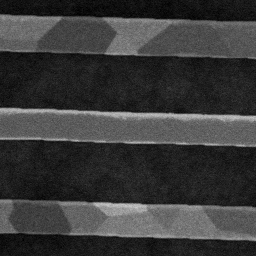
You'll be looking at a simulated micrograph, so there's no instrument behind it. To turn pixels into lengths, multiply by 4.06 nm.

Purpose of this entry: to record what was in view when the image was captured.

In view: lines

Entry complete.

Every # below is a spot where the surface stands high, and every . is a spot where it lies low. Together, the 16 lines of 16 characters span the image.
................
################
################
...........#####
................
................
................
################
################
................
................
................
................
################
################
................